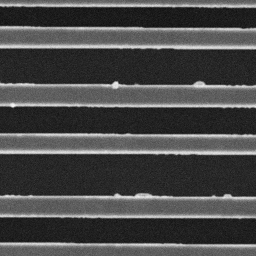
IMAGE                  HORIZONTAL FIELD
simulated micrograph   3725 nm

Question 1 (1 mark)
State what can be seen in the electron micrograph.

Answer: lines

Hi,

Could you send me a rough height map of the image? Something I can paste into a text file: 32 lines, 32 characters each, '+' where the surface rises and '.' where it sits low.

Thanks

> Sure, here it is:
++++++++++++++++++++++++++++++++
................................
................................
++++++++++++++++++..............
++++++++++++++++++++++++++++++++
++++++++++++++++++++++++++++++++
................................
................................
................................
................................
+++++.........+.................
++++++++++++++++++++++++++++++++
++++++++++++++++++++++++++++++++
................................
................................
................................
................................
++++++++++++++++++++++++++++++++
++++++++++++++++++++++++++++++++
................................
................................
................................
................................
................................
++++............................
++++++++++++++++++++++++++++++++
++++++++++++++++++++++++++++++++
................................
................................
................................
+++++++++.......................
++++++++++++++++++++++++++++++++